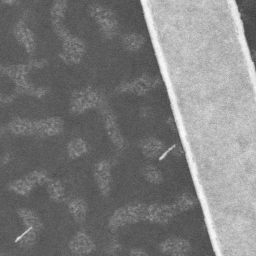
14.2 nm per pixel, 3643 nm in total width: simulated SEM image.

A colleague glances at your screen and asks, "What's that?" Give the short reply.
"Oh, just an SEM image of one or a few lines or trenches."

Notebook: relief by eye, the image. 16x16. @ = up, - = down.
---------@@@@@@-
---------@@@@@@-
----------@@@@@-
----------@@@@@-
----------@@@@@@
-----------@@@@@
-----------@@@@@
-----------@@@@@
------------@@@@
------------@@@@
------------@@@@
------------@@@@
-------------@@@
-------------@@@
-------------@@@
--------------@@